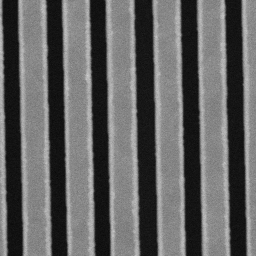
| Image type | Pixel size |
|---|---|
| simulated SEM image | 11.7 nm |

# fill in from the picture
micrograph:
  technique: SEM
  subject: lines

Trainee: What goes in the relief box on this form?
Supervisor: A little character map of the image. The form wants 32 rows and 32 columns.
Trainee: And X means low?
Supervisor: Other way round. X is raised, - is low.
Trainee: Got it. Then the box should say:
--XXXX--XXX--XXXX--XXX---XXX--XX
--XXXX--XXX--XXXX--XXXX--XXX--XX
--XXXX--XXX--XXXX--XXXX--XXX--XX
--XXXX--XXX--XXXX--XXXX--XXX--XX
--XXXX--XXX--XXXX--XXXX--XXX--XX
--XXXX--XXX--XXXX--XXXX--XXX--XX
--XXXX--XXX--XXXX--XXXX--XXX--XX
--XXXX--XXX--XXXX--XXXX--XXX--XX
--XXXX--XXX--XXXX--XXXX--XXX--XX
---XXX--XXX--XXXX--XXXX--XXX--XX
---XXX--XXX---XXX--XXXX--XXX--XX
---XXX--XXX---XXX--XXXX--XXX--XX
---XXX--XXX---XXX--XXXX--XXX--XX
---XXX--XXX---XXX--XXXX--XXX--XX
X--XXX--XXX---XXX--XXXX--XXX---X
---XXX--XXXX--XXX--XXXX--XXX---X
X--XXX--XXXX--XXX--XXXX--XXX---X
X--XXX--XXXX--XXX---XXX--XXX---X
X--XXX--XXXX--XXX---XXX--XXXX--X
X--XXX--XXXX--XXX---XXX--XXXX--X
X--XXX--XXXX--XXX---XXX--XXXX--X
X--XXX--XXXX--XXX---XXX--XXXX--X
X--XXX--XXXX--XXX---XXX--XXXX--X
X--XXX--XXXX--XXX---XXX--XXXX--X
X--XXX--XXXX--XXX---XXX--XXXX--X
X--XXX--XXXX--XXX---XXX--XXXX--X
X--XXX--XXXX--XXX---XXX--XXXX--X
X--XXX--XXXX--XXX---XXX--XXXX--X
X--XXX--XXXX--XXX---XXX--XXXX--X
X--XXX---XXX--XXX---XXX--XXXX--X
X--XXX---XXX--XXX---XXX--XXXX--X
X--XXX---XXX--XXX---XXX--XXXX--X